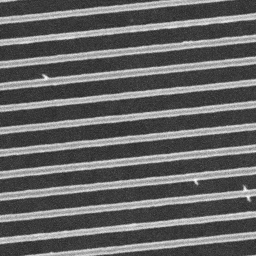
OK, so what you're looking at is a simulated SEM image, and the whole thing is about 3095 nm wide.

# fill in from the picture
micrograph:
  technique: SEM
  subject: parallel lines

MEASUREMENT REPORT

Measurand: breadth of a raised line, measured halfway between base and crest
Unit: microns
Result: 0.0796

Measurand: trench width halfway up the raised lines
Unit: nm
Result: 188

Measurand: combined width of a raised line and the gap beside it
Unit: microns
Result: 0.264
